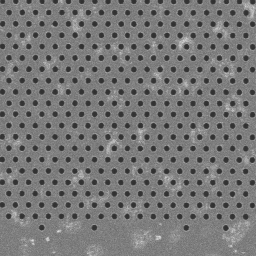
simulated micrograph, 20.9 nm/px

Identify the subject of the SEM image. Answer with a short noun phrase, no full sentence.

a regular array of holes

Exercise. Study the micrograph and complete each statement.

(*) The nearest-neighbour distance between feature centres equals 12.8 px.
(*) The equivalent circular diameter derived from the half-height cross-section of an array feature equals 5.97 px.